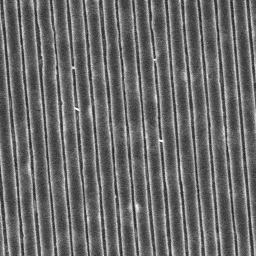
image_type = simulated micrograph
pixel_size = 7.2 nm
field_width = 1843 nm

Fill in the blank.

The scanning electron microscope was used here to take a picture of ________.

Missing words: parallel lines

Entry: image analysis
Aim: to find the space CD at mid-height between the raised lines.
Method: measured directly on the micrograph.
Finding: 23.3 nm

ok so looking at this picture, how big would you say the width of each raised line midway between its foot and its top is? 94.1 nm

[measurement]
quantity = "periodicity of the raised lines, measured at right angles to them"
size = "117 nm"